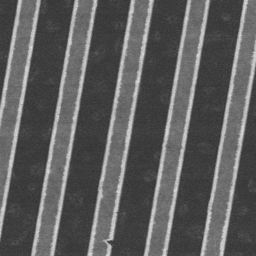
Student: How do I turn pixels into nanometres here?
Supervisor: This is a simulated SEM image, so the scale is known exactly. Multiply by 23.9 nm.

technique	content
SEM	parallel lines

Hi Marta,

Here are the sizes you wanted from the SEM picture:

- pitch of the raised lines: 1.33 micrometres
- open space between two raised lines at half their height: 897 nm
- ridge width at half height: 0.438 µm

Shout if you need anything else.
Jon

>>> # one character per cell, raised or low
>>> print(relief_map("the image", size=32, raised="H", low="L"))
LLHHHLLLLLHHLLLLLHHLLLLLHHLLLLLH
LLHHHLLLLHHHLLLLHHHLLLLHHHLLLLLH
LLHHLLLLLHHHLLLLHHLLLLLHHHLLLLHH
LLHHLLLLLHHLLLLLHHLLLLLHHLLLLLHH
LLHHLLLLLHHLLLLLHHLLLLLHHLLLLLHH
LLHHLLLLLHHLLLLLHHLLLLLHHLLLLLHH
LHHHLLLLLHHLLLLHHHLLLLLHHLLLLLHH
LHHHLLLLHHHLLLLHHHLLLLHHHLLLLLHH
LHHLLLLLHHLLLLLHHHLLLLHHHLLLLHHH
LHHLLLLLHHLLLLLHHLLLLLHHLLLLLHHL
LHHLLLLLHHLLLLLHHLLLLLHHLLLLLHHL
LHHLLLLLHHLLLLLHHLLLLLHHLLLLLHHL
HHHLLLLHHHLLLLHHHLLLLLHHLLLLLHHL
HHHLLLLHHHLLLLHHHLLLLHHHLLLLHHHL
HHLLLLLHHLLLLLHHLLLLLHHHLLLLHHHL
HHLLLLLHHLLLLLHHLLLLLHHLLLLLHHLL
HHLLLLLHHLLLLLHHLLLLLHHLLLLLHHLL
HHLLLLLHHLLLLLHHLLLLLHHLLLLLHHLL
HHLLLLHHHLLLLHHHLLLLLHHLLLLLHHLL
HHLLLLHHHLLLLHHHLLLLHHHLLLLHHHLL
HLLLLLHHLLLLLHHLLLLLHHHLLLLHHHLL
HLLLLLHHLLLLLHHLLLLLHHLLLLLHHLLL
HLLLLLHHLLLLLHHLLLLLHHLLLLLHHLLL
HLLLLLHHLLLLHHHLLLLLHHLLLLLHHLLL
HLLLLHHHLLLLHHHLLLLLHHLLLLLHHLLL
LLLLLHHHLLLLHHHLLLLHHHLLLLHHHLLL
LLLLLHHLLLLLHHLLLLLHHLLLLLHHHLLL
LLLLLHHLLLLLHHLLLLLHHLLLLLHHLLLL
LLLLLHHLLLLLHHLLLLLHHLLLLLHHLLLL
LLLLLHHLLLLLHHLLLLLHHLLLLLHHLLLL
LLLLHHHLLLLHHLLLLLHHHLLLLLHHLLLL
LLLLHHHLLLLHHHLLLLHHHLLLLHHHLLLL